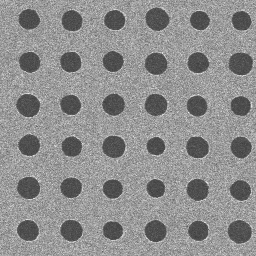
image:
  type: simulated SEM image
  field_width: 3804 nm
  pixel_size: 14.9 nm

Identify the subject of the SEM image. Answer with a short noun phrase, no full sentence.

a regular array of holes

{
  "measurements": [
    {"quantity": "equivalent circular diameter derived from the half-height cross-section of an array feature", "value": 0.318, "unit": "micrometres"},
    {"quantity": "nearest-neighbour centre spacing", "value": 616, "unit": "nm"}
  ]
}